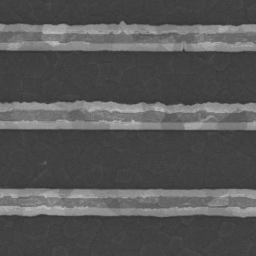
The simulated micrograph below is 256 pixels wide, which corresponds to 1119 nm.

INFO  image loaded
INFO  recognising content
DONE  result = one or a few lines or trenches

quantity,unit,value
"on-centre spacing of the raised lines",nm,359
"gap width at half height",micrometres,0.278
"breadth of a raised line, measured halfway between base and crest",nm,82.4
